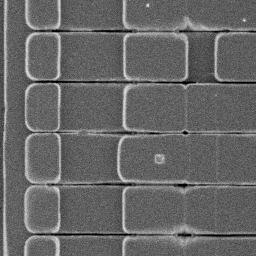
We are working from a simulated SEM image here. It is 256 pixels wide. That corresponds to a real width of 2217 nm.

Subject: wiring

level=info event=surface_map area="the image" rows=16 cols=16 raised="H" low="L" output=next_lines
LLHHLLLLHHHHHHHH
LLHHLLLLHHHHHHHH
LLHHLLLLHHHHLLHH
LLHHLLLLHHHHLLHH
LLHHLLLLHHHHLLHH
LLHHLLLLHHHHHHHH
LLHHLLLLHHHHHHHH
LLHHLLLLHHHHHHHH
LLHHLLLLHHHHHHHH
LLHHLLLHHHHHHHHH
LLHHLLLHHHHHHHHH
LLHLLLLLHHHHHHHH
LLHHLLLLHHHHHHHH
LLHHLLLLHHHHHHHH
LLHLLLLLHHHLHHHH
LLHHLLLLHHHHHHHH